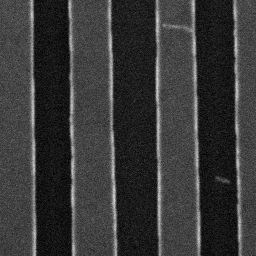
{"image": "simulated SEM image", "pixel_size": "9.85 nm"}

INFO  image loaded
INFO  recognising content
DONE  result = lines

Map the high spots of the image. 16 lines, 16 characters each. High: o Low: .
oo..ooo...oo...o
oo..ooo...oo...o
oo..ooo...oo...o
oo..ooo...oo...o
oo..ooo...oo...o
oo..ooo...oo...o
oo..ooo...oo...o
oo..ooo...oo...o
oo..ooo...oo...o
oo..ooo...oo...o
oo..ooo...oo...o
oo..ooo...oo...o
oo..ooo...oo...o
oo...oo...oo...o
oo...oo...oo...o
oo...oo...oo...o